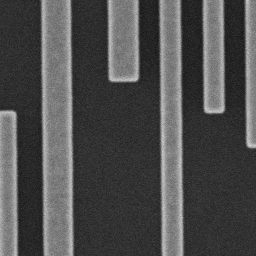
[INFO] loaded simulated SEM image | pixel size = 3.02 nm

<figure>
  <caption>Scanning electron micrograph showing groups of lines, slits or small figures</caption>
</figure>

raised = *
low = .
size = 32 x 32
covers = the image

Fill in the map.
.....****.....***...***..***...*
.....****.....***...***..***...*
.....****.....***...***..***...*
.....****.....***...***..***...*
.....****.....***...***..***...*
.....****.....***...***..***...*
.....****.....***...***..***...*
.....****.....***...***..***...*
.....****.....***...***..***...*
.....****.....***...***..***...*
.....****...........***..***...*
.....****...........***..***...*
.....****...........***..***...*
.....****...........***...**...*
**...****...........***........*
**...****...........***........*
**...****...........***........*
**...****...........***........*
**...****...........***.........
**...****...........***.........
**...****...........***.........
**...****...........***.........
**....***...........***.........
**....***...........***.........
**....***...........***.........
**....***...........***.........
**....***...........***.........
**....***...........***.........
**....***...........***.........
**....***...........***.........
**....***...........***.........
**....***...........***.........